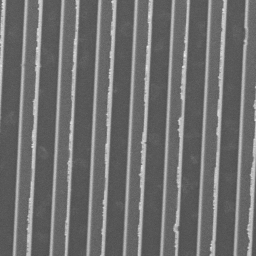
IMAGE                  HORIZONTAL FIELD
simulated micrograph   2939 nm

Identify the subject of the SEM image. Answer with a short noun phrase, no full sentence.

parallel lines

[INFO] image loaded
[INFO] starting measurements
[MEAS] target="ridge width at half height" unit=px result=15.9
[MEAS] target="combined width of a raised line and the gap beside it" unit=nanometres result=422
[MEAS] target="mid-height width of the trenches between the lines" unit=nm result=246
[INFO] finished